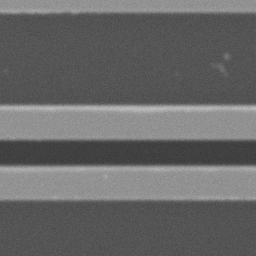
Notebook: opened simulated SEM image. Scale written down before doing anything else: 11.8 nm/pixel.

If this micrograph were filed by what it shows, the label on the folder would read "lines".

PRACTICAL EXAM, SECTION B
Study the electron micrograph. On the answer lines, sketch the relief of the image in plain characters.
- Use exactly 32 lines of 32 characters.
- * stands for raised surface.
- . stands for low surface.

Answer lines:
********************************
**********..*...................
................................
................................
................................
................................
................................
................................
................................
................................
................................
................................
................................
********************************
********************************
********************************
********************************
................................
................................
................................
................................
********************************
********************************
********************************
********************************
................................
................................
................................
................................
................................
................................
................................